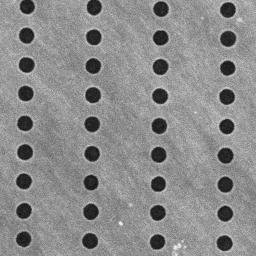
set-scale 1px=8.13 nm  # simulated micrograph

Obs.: a regular array of holes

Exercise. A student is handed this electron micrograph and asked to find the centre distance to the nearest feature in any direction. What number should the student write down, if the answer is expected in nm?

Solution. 234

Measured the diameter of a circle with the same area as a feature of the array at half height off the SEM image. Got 130 nm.